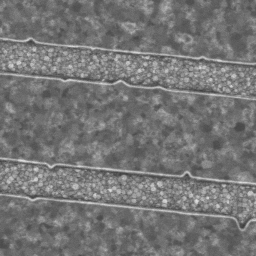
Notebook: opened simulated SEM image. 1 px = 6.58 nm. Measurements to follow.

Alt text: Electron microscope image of one or a few lines or trenches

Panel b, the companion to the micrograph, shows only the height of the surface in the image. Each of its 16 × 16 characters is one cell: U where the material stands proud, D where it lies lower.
UUUUUUUUUUUUUUUU
UUUUUUUUUUUUUUUU
DUUUUUUUUUUUUUUU
DDDDDDDDDDDUUUUU
DDDDDDDDDDDDDDDD
UUUUUUUUUUDDDDDD
UUUUUUUUUUUUUUUU
UUUUUUUUUUUUUUUU
UUUUUUUUUUUUUUUU
UUUUUUUUUUUUUUUU
DDDDDDUUUUUUUUUU
DDDDDDDDDDDDDDDD
UUUUDDDDDDDDDDDD
UUUUUUUUUUUUUUDD
UUUUUUUUUUUUUUUU
UUUUUUUUUUUUUUUU